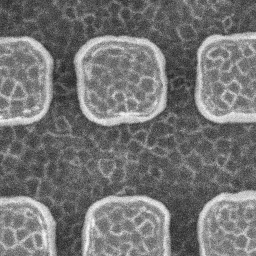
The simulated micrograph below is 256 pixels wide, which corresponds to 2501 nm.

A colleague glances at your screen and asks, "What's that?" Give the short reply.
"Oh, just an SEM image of raised bodies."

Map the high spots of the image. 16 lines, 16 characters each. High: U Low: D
DDDDDDDDDDDDDDDD
DDDDDDDDDDDDDDDD
UUDDDDUUDDDDDUUU
UUUDDUUUUUDDUUUU
UUUDDUUUUUDDUUUU
UUUDDUUUUUDDUUUU
UUUDDUUUUUDDUUUU
UUDDDDUDDDDDDDDD
DDDDDDDDDDDDDDDD
DDDDDDDDDDDDDDDD
DDDDDDDDDDDDDDDD
DDDDDDDDDDDDDDDD
UUDDDDDUUDDDDUUU
UUUDDDUUUUUDDUUU
UUUDDUUUUUDDUUUU
UUUDDUUUUUDDDUUU